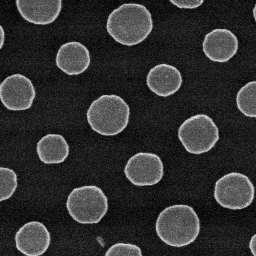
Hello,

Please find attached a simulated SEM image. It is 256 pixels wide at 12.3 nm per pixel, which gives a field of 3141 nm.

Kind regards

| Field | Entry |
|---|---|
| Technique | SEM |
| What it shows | a regular array of raised bodies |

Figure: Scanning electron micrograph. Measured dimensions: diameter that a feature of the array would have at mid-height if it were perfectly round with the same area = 464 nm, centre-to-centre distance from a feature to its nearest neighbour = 802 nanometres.